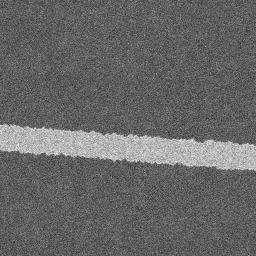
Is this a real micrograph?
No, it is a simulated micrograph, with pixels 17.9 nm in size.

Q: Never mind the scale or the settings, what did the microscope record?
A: one or a few lines or trenches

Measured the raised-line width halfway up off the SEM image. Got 0.434 microns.